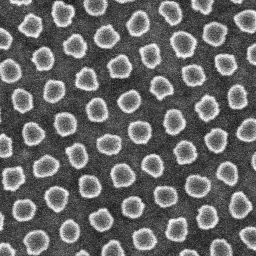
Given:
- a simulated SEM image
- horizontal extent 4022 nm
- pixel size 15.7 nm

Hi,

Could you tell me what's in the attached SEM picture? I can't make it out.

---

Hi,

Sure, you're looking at a regular array of raised bodies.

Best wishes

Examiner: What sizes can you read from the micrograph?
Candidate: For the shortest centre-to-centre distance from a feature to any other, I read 520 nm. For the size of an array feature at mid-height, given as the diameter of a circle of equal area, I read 337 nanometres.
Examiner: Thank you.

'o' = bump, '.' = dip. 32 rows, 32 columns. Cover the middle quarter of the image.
...........oooooo....oo........o
.....oo.....ooooo.............oo
....oooo....oooo..............oo
...ooooo...............oo.....oo
...ooooo..............oooo....oo
...ooooo..............ooooo.....
......................ooooo.....
...............ooo.....oooo.....
..............ooooo.....o.......
.......ooo...oooooo.............
......oooo....ooooo.............
......ooooo....oo...............
o.....ooooo...............ooo...
oo....ooooo..............ooooo..
ooo...............o......ooooo..
ooo.............ooooo....ooooo..
ooo.............oooooo....ooo...
o...............oooooo..........
.........ooooo...oooo...........
........oooooo....oo.........oo.
..ooo...oooooo..............oooo
.oooo....ooooo..............oooo
.ooooo.....o................oooo
.ooooo..............oooo....oooo
..oooo..............oooo....oooo
...oo........ooo....oooo........
............ooooo...ooooo.......
............ooooo.....oo........
.....ooo....oooooo.............o
....oooo....ooooo..............o
....ooooo....o.................o
....ooooo..............ooooo...o